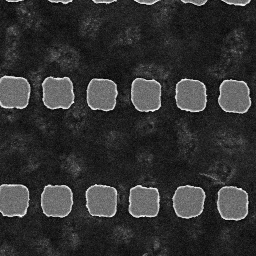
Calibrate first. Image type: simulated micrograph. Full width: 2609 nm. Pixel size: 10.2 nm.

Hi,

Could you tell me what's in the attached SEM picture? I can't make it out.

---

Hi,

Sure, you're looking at a regular array of raised bodies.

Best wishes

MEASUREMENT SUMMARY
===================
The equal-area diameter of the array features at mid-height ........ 337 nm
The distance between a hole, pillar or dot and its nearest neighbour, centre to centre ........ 446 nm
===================